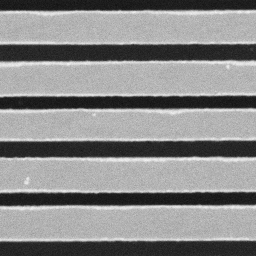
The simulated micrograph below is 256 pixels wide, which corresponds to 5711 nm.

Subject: lines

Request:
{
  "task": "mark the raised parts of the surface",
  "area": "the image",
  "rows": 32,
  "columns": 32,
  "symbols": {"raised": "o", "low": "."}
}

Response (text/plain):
................................
oooooooooooooooooooooooooooooooo
oooooooooooooooooooooooooooooooo
oooooooooooooooooooooooooooooooo
oooooooooooooooooooooooooooooooo
oooooooooooooooooooo.o.o........
................................
................................
oooooooooooooooooooooooooooooooo
oooooooooooooooooooooooooooooooo
oooooooooooooooooooooooooooooooo
oooooooooooooooooooooooooooooooo
................................
................................
oooooooooooooooooooooooooooooooo
oooooooooooooooooooooooooooooooo
oooooooooooooooooooooooooooooooo
oooooooooooooooooooooooooooooooo
................................
................................
oooooooooooooooooooooooooooooooo
oooooooooooooooooooooooooooooooo
oooooooooooooooooooooooooooooooo
oooooooooooooooooooooooooooooooo
................................
................................
oooooooooooooooooooooooooooooooo
oooooooooooooooooooooooooooooooo
oooooooooooooooooooooooooooooooo
oooooooooooooooooooooooooooooooo
................................
................................